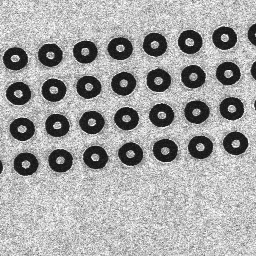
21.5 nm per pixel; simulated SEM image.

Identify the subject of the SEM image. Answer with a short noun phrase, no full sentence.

a regular array of ring-shaped grooves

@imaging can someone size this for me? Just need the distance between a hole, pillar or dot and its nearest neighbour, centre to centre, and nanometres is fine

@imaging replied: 750